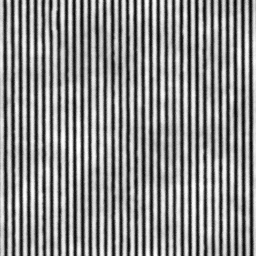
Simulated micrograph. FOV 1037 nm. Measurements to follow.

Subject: parallel lines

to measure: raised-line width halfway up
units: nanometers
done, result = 17.2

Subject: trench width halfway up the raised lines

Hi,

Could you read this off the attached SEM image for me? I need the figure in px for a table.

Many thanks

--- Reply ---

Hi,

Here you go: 3.38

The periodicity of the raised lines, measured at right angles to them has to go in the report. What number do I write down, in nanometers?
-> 31.1